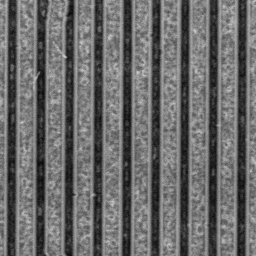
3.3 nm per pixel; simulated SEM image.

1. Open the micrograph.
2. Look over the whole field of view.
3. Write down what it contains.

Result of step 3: parallel lines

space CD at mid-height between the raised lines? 0.0388 micrometres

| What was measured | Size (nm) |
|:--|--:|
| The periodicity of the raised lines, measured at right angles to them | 94.9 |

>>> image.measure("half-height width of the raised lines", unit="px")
17.6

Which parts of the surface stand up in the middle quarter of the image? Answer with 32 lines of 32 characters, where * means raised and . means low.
...****...****...****....****...
...****...****...****....****...
...****...****...****....****...
...****...****...****....****...
...****...****...****....***....
...****...****...****....***....
...****...****...****....****...
...****...****...****....****...
...****...****...****....****...
...****...****...****....***....
...****...****...****....***....
...****...****...****....***....
...****...****...****....***....
...****...****...****....***....
...****...****...****...*****...
...****...****...****...*****...
...****...****...****...*****...
...****...****...****...*****...
...****...****...****...*****...
...****...****...****...*****...
...****...****...****...*****...
...****...****...****...*****...
...****...****...****...*****...
...****...****...****...*****...
...****...****...****...*****...
...****...****...****...*****...
...****...****...****...*****...
...****...****...****...*****...
...****...****...****...*****...
...****...****...****...*****...
...****...****...****...*****...
...****...****...****...*****...